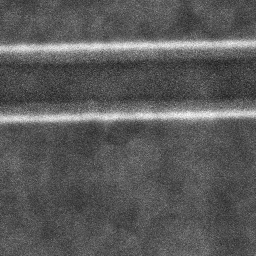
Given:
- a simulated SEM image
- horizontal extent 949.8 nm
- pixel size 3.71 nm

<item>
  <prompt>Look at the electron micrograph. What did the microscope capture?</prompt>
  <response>one or a few lines or trenches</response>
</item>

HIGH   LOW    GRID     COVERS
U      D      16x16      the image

UUUUUUUUUUUUUUUU
UUUUUUUUUUUUUUUU
UUUUUUUUUUUUUUUU
DDDDDDDDDDDDDDDD
DDDDDDDDDDDDDDDD
DDDDDDDDDDDDDDDD
DDDDDDDDDDDDDDDD
UUUUUUUUUUUUUUUU
UUUUUUUUUUUUUUUU
UUUUUUUUUUUUUUUU
UUUUUUUUUUUUUUUU
UUUUUUUUUUUUUUUU
UUUUUUUUUUUUUUUU
UUUUUUUUUUUUUUUU
UUUUUUUUUUUUUUUU
UUUUUUUUUUUUUUUU